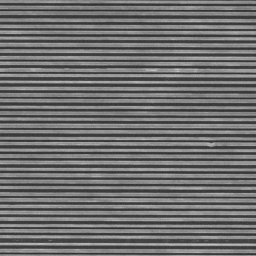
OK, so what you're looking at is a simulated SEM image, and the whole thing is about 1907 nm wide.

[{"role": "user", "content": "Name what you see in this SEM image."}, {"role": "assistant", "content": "parallel lines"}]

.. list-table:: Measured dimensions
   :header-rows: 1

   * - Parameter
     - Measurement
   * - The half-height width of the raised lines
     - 27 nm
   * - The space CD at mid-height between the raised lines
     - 0.0205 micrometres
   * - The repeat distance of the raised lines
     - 46.4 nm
